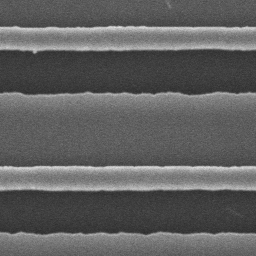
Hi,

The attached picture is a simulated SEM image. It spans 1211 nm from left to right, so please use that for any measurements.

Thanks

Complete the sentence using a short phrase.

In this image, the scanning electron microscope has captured lines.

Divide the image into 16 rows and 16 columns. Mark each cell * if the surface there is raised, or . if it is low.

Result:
****************
****************
****************
................
................
................
****************
****************
****************
****************
****************
****************
................
................
................
****************